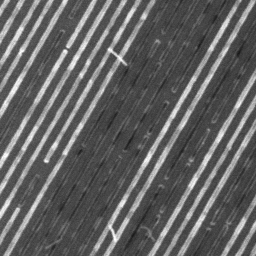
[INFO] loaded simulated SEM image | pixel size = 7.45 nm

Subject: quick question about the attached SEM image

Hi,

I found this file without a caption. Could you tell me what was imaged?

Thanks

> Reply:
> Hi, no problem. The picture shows parallel lines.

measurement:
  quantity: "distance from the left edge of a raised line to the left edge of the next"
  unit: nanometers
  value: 93.5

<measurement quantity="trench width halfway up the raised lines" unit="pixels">9.09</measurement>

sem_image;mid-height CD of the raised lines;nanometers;25